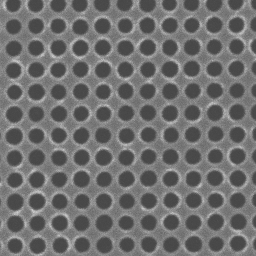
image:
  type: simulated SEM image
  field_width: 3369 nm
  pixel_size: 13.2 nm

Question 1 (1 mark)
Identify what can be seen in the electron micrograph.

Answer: a regular array of holes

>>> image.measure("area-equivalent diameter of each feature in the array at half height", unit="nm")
218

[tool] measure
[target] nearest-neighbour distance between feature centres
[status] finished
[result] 285 nanometres